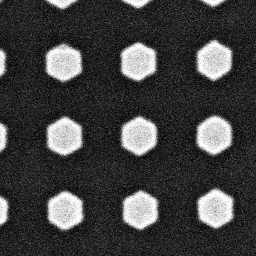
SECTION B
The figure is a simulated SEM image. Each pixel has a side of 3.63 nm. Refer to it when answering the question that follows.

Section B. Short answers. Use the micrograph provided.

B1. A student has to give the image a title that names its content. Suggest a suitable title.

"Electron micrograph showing a regular array of raised bodies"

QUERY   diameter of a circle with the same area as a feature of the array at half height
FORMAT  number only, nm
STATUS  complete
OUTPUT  119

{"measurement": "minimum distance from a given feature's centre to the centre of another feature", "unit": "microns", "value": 0.269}